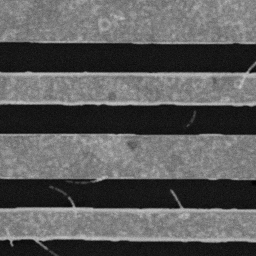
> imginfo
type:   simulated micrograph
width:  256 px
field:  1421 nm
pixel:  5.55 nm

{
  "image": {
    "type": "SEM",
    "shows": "lines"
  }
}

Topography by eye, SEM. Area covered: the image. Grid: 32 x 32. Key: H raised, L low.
HHHHHHHHHHHHHHHHHHHHHHHHHHHHHHHH
HHHHHHHHHHHHHHHHHHHHHHHHHHHHHHHH
HHHHHHHHHHHHHHHHHHHHHHHHHHHHHHHH
HHHHHHHHHHHHHHHHHHHHHHHHHHHHHHHH
HHHHHHHHHHHHHHHHHHHHHHHHHHHHHHHH
LLLLLLLLLLLLLLLLLLLLLLLLLLLLLLLL
LLLLLLLLLLLLLLLLLLLLLLLLLLLLLLLL
LLLLLLLLLLLLLLLLLLLLLLLLLLLLLLLL
LLLLLLLLLLLLLLLLLLLLLLLLLLLLLLLL
HHHHHHHHHHHHHHHHHHHHHHHHHHHHHHHH
HHHHHHHHHHHHHHHHHHHHHHHHHHHHHHHH
HHHHHHHHHHHHHHHHHHHHHHHHHHHHHHHH
HHHHHHHHHHHHHHHHHHHHHHHHHHHHHHHH
LLLLLLLLLLLLLLLLLLLLLLLLLLLLLLLL
LLLLLLLLLLLLLLLLLLLLLLLLLLLLLLLL
LLLLLLLLLLLLLLLLLLLLLLLLLLLLLLLL
LLLLLLLLLLLLLLLLLLLLLLLLLLLLLLLL
HHHHHHHHHHHHHHHHHHHHHHHHHHHHHHHH
HHHHHHHHHHHHHHHHHHHHHHHHHHHHHHHH
HHHHHHHHHHHHHHHHHHHHHHHHHHHHHHHH
HHHHHHHHHHHHHHHHHHHHHHHHHHHHHHHH
HHHHHHHHHHHHHHHHHHHHHHHHHHHHHHHH
LLLLLLLLLLLLLLLLLLLLLLLLLLLLLLLL
LLLLLLLLLLLLLLLLLLLLLLLLLLLLLLLL
LLLLLLLLLLLLLLLLLLLLLLLLLLLLLLLL
LLLLLLLLLLLLLLLLLLLLLLLLLLLLLLLL
HHHHHHHHHHHHHHHHHHHHHHHHHHHHHHHH
HHHHHHHHHHHHHHHHHHHHHHHHHHHHHHHH
HHHHHHHHHHHHHHHHHHHHHHHHHHHHHHHH
HHHHHHHHHHHHHHHHHHHHHHHHHHHHHHHH
LLLLLLLLLLLLLLLLLLLLLLLLLLLLLLLL
LLLLLLLLLLLLLLLLLLLLLLLLLLLLLLLL